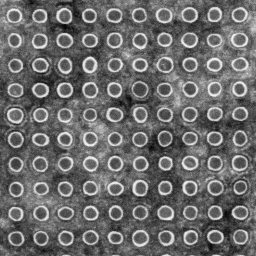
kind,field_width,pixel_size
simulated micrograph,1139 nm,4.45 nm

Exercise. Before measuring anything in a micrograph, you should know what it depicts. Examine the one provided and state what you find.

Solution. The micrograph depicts a regular array of raised bodies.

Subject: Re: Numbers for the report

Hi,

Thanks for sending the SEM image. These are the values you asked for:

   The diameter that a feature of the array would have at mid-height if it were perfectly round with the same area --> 14.2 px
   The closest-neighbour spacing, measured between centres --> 108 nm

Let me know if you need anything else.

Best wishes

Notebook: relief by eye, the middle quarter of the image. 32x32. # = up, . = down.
##...###...###...####..####...##
##...##.....##....##....###...##
................................
................................
..................#.............
##...###...###...####...###...##
##...###...###...####..####...##
##...###...###...####...##....##
................................
................................
................................
#.....##...###....##....##....##
##...###...####..####..####...##
##...###...###....###...###...##
................................
................................
................................
#....###....##....##....###...##
##...###...###...####..####...##
##...###...###...####...###...##
..................##.....#......
................................
................................
#.....##....##....##....##....##
##...###...###...####...###...##
##...###...###...####...###...##
#.................##............
................................
................................
..................##.....#.....#
##...###...####...###...###...##
##...###...####...###...###...##